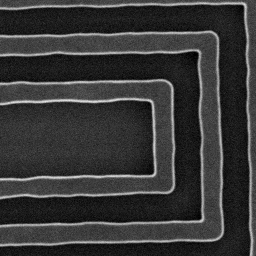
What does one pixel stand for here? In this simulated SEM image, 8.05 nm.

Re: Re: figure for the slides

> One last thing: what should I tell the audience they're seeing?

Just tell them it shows groups of lines, slits or small figures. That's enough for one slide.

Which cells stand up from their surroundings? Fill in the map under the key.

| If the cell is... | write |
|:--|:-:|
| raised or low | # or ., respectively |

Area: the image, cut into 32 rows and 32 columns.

#########################.##..##
...............................#
...............................#
...............................#
#..########################....#
###########################....#
#######################..##....#
.........................##....#
.........................##....#
.........................##....#
#####################....##....#
######################...##....#
###############..#####...##....#
...................###...##....#
...................###...##....#
...................###...##....#
...................###...###...#
...................###...###...#
...................###...###...#
...................###...###...#
...................###...###...#
...................###...###...#
######################...###...#
######################...###...#
##..##...................###...#
.........................###...#
.........................###...#
.........................###...#
############################...#
############################...#
########.......................#
...............................#